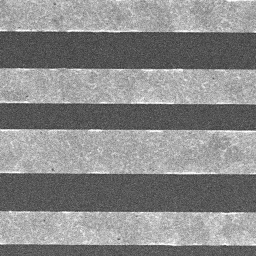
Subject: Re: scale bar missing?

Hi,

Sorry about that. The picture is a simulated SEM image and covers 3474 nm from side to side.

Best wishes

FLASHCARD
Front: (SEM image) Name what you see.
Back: one or a few lines or trenches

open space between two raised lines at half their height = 507 nanometres